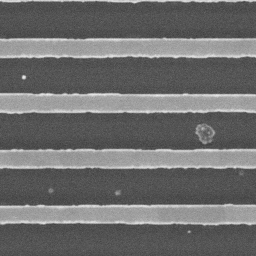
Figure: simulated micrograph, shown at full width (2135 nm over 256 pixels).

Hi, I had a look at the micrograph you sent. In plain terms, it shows lines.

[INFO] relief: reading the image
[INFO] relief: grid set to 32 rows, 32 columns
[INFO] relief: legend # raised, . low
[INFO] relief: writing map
................................
................................
................................
................................
................................
################################
################################
................................
................................
................................
................................
................................
################################
################################
................................
................................
................................
................................
................................
################################
################################
................................
................................
................................
................................
................................
################################
################################
................................
................................
................................
................................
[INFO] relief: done